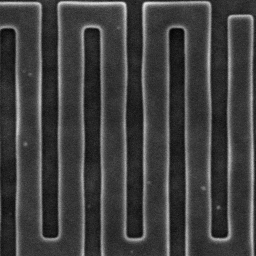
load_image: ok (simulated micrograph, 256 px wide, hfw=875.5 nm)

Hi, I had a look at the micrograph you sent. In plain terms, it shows groups of lines, slits or small figures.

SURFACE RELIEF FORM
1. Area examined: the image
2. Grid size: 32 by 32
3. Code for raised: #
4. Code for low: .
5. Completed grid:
#####..########...########......
#####..#########..########......
#####..#########..########..####
#####..####.####..########..####
..###..###...###..###..###..####
..###..###...###..###..###...###
..###..###...###..###..###...###
..###..###...###..###..###...###
..###..###...###..###..###...###
..###..###...###..###..###...###
..###..###...###..###..###...###
..###..###...###..###..###...###
..###..###...###..###..###..####
..###..###...###..###..###..####
..###..###...###..###..###..####
..###..###...###..###..###..####
..###..###...###..###..###..####
..###..###...###..###..###...###
..###..###...###..###..###...###
..###..###...###..###..###...###
..###..###...###..###..###...###
..###..###...###..###..###...###
..###..###...###..###..###..####
..###..###...###..###..###..####
..###..###...###..###..###..####
..###..###...###..###..###..####
..###..###...###..###..###..####
..###..###...###..###..###..####
..###..###...###..###..###...###
..####.###...###..###..####.####
..########...########..#########
..########...########..#########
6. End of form